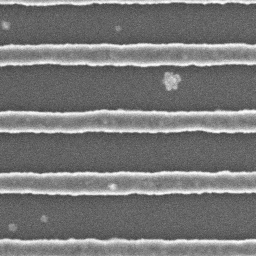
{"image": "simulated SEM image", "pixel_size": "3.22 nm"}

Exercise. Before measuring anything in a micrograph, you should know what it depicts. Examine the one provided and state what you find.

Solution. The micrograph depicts lines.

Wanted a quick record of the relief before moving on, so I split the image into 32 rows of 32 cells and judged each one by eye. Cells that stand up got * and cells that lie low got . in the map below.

...*****.**.....................
................................
................................
................................
................................
................................
********************************
********************************
................................
................................
.....................*..........
................................
................................
................................
********************************
********************************
.**.******.....*.****......*****
................................
................................
................................
................................
................................
********************************
********************************
................................
................................
................................
................................
................................
................................
********************************
********************************